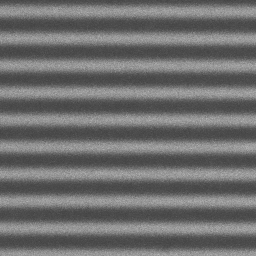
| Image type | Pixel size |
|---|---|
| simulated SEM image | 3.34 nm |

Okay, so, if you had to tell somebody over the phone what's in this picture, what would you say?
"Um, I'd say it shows parallel lines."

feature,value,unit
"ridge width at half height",0.0355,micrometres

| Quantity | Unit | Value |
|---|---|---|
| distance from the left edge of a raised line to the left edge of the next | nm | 90.5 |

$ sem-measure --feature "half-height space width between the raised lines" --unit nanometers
53.4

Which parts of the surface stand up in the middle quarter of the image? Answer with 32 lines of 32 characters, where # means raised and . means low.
################################
################################
................................
................................
................................
................................
################################
################################
..............##################
................................
................................
................................
................................
################################
################################
................................
................................
................................
................................
................................
################################
################################
................................
................................
................................
................................
################################
################################
################################
................................
................................
................................